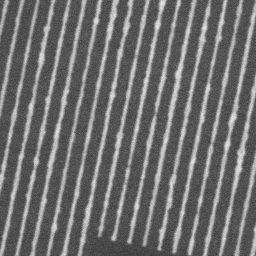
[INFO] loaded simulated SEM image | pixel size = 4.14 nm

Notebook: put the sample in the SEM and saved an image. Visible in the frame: parallel lines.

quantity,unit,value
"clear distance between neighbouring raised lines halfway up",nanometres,49.7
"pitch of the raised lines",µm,0.0636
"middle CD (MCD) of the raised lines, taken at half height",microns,0.0116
